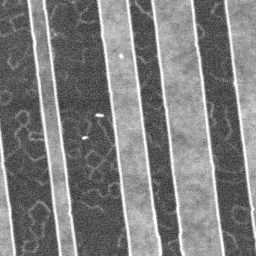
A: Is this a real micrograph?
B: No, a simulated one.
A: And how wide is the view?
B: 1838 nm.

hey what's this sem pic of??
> one or a few lines or trenches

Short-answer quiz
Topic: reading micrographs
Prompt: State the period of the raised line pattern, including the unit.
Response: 485 nanometres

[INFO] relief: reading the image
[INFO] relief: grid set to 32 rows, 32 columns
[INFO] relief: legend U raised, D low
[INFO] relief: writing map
UUUUDDUUUUUUDDDDUUUDDDDDUUUUDDDD
UUUUDDUUUUUUUDDDUUUDDDDDUUUUDDDD
UUUUDDUUUUUUUDDDUUUDDDDDUUUUUDDD
UUUUDDUUUUUUUDDDUUUUDDDDUUUUUDDD
UUUUDDUUUUUUUDDDUUUUDDDDUUUUUDDD
UUUUDDUUUUUUUDDDDUUUDDDDDUUUUDDD
UUUUDDUUUUUUUDDDDUUUDDDDDUUUUDDD
UUUUUDUUUUUUUDDDDUUUDDDDDUUUUDDD
UUUUUDDUUUUUUDDDDUUUDDDDDUUUUDDD
UUUUUDDUUUUUUUDDDUUUDDDDDUUUUDDD
UUUUUDDUUUUUUUDDDUUUDDDDDUUUUDDD
UUUUUDDUUUUUUUDDDUUUDDDDDUUUUUDD
UUUUUDDUUUUUUUDDDUUUUDDDDDUUUUDD
UUUUUDDUUUUUUUDDDDUUUDDDDDUUUUDD
UUUUUDDUUUUUUUDDDDUUUDDDDDUUUUDD
UUUUUUDUUUUUUUDDDDUUUDDDDDUUUUDD
UUUUUUDDUUUUUUDDDDUUUDDDDDUUUUDD
UUUUUUDDUUUUUUUDDDUUUDDDDDUUUUDD
UUUUUUDDUUUUUUUDDDUUUDDDDDUUUUUD
UUUUUUDDUUUUUUUDDDUUUDDDDDUUUUUD
UUUUUUDDUUUUUUUDDDUUUUDDDDDUUUUD
DUUUUUDDUUUUUUUDDDDUUUDDDDDUUUUD
DUUUUUDDUUUUUUUDDDDUUUDDDDDUUUUD
DUUUUUUDUUUUUUUDDDDUUUDDDDDUUUUD
DUUUUUUDDUUUUUUDDDDUUUDDDDDUUUUD
DUUUUUUDDUUUUUUDDDDUUUDDDDDUUUUD
DUUUUUUDDUUUUUUUDDDUUUDDDDDUUUUU
DUUUUUUDDUUUUUUUDDDUUUDDDDDUUUUU
DUUUUUUDDUUUUUUUDDDDUUUDDDDUUUUU
DDUUUUUDDUUUUUUUDDDDUUUDDDDDUUUU
DDUUUUUDDUUUUUUUDDDDUUUDDDDDUUUU
DDUUUUUUDUUUUUUUDDDDUUUDDDDDUUUU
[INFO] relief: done